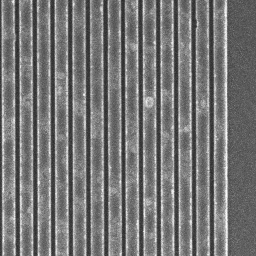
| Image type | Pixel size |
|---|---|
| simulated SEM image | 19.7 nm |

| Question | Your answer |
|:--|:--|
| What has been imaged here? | parallel lines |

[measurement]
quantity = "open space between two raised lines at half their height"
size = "108 nanometers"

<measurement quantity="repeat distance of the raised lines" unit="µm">0.348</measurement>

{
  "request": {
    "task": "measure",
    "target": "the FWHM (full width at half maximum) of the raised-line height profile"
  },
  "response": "239 nanometers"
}